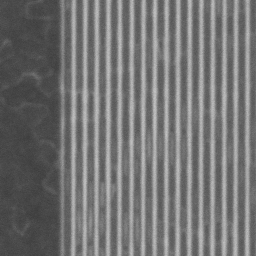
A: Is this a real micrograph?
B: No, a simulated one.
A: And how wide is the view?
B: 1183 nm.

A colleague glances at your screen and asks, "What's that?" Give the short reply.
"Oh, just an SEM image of parallel lines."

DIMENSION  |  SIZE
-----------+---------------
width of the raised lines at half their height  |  3.38 px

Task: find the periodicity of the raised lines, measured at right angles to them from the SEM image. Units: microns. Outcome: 0.0536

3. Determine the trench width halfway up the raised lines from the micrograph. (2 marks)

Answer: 39.3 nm